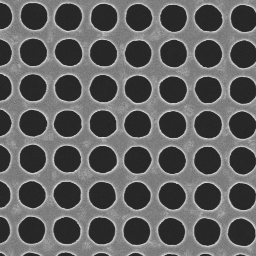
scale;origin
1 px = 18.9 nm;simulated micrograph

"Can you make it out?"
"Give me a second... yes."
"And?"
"a regular array of holes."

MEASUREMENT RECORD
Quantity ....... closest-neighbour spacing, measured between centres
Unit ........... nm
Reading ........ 657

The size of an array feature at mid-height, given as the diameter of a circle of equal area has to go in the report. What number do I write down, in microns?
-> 0.514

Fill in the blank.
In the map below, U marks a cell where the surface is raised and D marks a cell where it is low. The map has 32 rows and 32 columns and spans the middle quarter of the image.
UDUUUUUUUDDUUUUUUDDDUUUUUUDDDUUU
UUUUUUUUUUUUUUUUUUUUUUUUUUUUUUUU
UUUUUUUUUUUUUUUUUUUUUUUUUUUUUUUU
DDDUUUUUDDDDUUUUDDDDDUUUUUDDDUUU
DDDDUUUDDDDDDUUDDDDDDDUUDDDDDDUU
DDDDUUDDDDDDDUUDDDDDDDUUDDDDDDDU
DDDDDUDDDDDDDUUDDDDDDDUUDDDDDDDU
DDDDUUUDDDDDDUUDDDDDDDUUDDDDDDDU
DDDDUUUDDDDDUUUUDDDDDUUUUDDDDDUU
UUUUUUUUUDDUUUUUUDDDUUUUUUDDDUUU
UUUUUUUUUUUUUUUUUUUUUUUUUUUUUUUU
UUUUUUUUUDUUUUUUUUDUUUUUUUUUUUUU
DDDUUUUDDDDDUUUUDDDDDUUUUDDDDUUU
DDDDUUUDDDDDDUUDDDDDDUUUDDDDDDUU
DDDDUUDDDDDDDUUDDDDDDDUUDDDDDDUU
DDDDUUDDDDDDDUUDDDDDDDUUDDDDDDDU
DDDDUUUDDDDDDUUDDDDDDUUUDDDDDDUU
DDDUUUUUDDDDUUUUDDDDDUUUUDDDDDUU
UUUUUUUUUUUUUUUUUUDUUUUUUUUDUUUU
UUUUUUUUUUUUUUUUUUUUUUUUUUUUUUUU
DUUUUUUUUDUUUUUUUUDUUUUUUUUUUUUU
DDDUUUUDDDDDUUUUDDDDDUUUUDDDDUUU
DDDDUUUDDDDDDUUDDDDDDUUUDDDDDDUU
DDDDUUDDDDDDDUUDDDDDDDUUDDDDDDUU
DDDDUUDDDDDDDUUDDDDDDDUUDDDDDDUU
DDDDUUUDDDDDDUUDDDDDDUUUDDDDDDUU
DDDUUUUDDDDDUUUUDDDDDUUUUDDDDUUU
UUUUUUUUUUUUUUUUUDDUUUUUUUDUUUUU
UUUUUUUUUUUUUUUUUUUUUUUUUUUUUUUU
DUUUUUUUUDUUUUUUUDDUUUUUUUUUUUUU
DDDUUUUDDDDDUUUUDDDDDUUUDDDDDUUU
DDDDUUDDDDDDDUUDDDDDDUUUDDDDDDUU